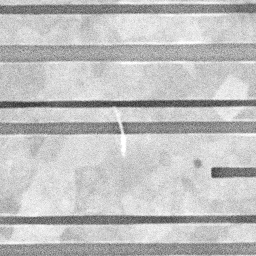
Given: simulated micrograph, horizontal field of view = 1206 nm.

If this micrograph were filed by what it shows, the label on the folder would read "groups of lines, slits or small figures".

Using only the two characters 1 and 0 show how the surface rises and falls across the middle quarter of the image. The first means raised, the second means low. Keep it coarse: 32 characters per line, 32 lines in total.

11111111111111111111111111111111
11111111111111111111111111111111
11111111111111111111111111111111
11111111111111111111111111111111
11111111111111111111111111111111
11111111111111111111111111111111
11111111111111111111111111111111
11111111111111111111111111111111
11111111111111111111111111111111
00000000000000000000000000000000
00000000000000000000000000000000
11111111111111111111111111111111
11111111111111111111111111111111
11111111111111111111111111111111
00000000000001100000000000000000
00000000000000000000000000000000
00000000000000000000000000000000
00000000000000000000000000000000
11111111111111111111111111111111
11111111111111111111111111111111
11111111111111111111111111111111
11111111111111111111111111111111
11111111111111111111111111111111
11111111111111111111111111111111
11111111111111111111111111111111
11111111111111111111111111111111
11111111111111111111111111111111
11111111111111111111111111111111
11111111111111111111111111111111
11111111111111111111111111111111
11111111111111111111111111111111
11111111111111111111111111111111